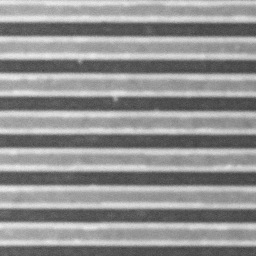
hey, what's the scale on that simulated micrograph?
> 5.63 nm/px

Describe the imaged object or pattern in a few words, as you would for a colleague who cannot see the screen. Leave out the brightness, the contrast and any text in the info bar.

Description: parallel lines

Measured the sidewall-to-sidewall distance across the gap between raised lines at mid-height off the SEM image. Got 110 nm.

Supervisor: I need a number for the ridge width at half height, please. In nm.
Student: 101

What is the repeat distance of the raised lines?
0.21 microns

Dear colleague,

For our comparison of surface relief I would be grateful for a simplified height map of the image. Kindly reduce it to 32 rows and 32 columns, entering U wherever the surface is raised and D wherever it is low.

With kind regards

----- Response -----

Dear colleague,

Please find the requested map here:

UUUUUUUUUUUUUUUUUUUUUUUUUUUUUUUU
UUUUUUUUUUUUUUUUUUUUUUUUUUUUUUUU
DDDDDDDDDDDDDDDDDDDDDDDDDDDDDDDD
DDDDDDDDDDDDDDDDDDDDDDDDDDDDDDDD
DDDDDDDDDDDDDDDDDDDDDDDDDDDDDDDD
UUUUUUUUUUUUUUUUUUUUUUUUUUUUUUUU
UUUUUUUUUUUUUUUUUUUUUUUUUUUUUUUU
DDDDDDDDDDDDDDDDDDDDDDDDDDDDDDDD
DDDDDDDDDDDDDDDDDDDDDDDDDDDDDDDD
DDDDDDDDDDDDDDDDDDDDDDDDDDDDDDDD
UUUUUUUUUUUUUUUUUUUUUUUUUUUUUUUU
UUUUUUUUUUUUUUUUUUUUUUUUUUUUUUUU
DDDDDDDDDDDDDDDDDDDDDDDDDDDDDDDD
DDDDDDDDDDDDDDDDDDDDDDDDDDDDDDDD
UUUUUUUUUUUUUUUUUUUUUUUUUUUUUUUU
UUUUUUUUUUUUUUUUUUUUUUUUUUUUUUUU
DDDDDDDDDDDDDDDDDDDDDDDDDDDDDDDD
DDDDDDDDDDDDDDDDDDDDDDDDDDDDDDDD
DDDDDDDDDDDDDDDDDDDDDDDDDDDDDDDD
UUUUUUUUUUUUUUUUUUUUUUUUUUUUUUUU
UUUUUUUUUUUUUUUUUUUUUUUUUUUUUUUU
DDDDDDDDDDDDDDDDDDDDDDDDDDDDDDDD
DDDDDDDDDDDDDDDDDDDDDDDDDDDDDDDD
DDDDDDDDDDDDDDDDDDDDDDDDDDDDDDDD
UUUUUUUUUUUUUUUUUUUUUUUUUUUUUUUU
UUUUUUUUUUUUUUUUUUUUUUUUUUUUUUUU
DDDDDDDDDDDDDDDDDDDDDDDDDDDDDDDD
DDDDDDDDDDDDDDDDDDDDDDDDDDDDDDDD
UUUUUUUUUUUUUUUUUUUUUUUUUUUUUUUU
UUUUUUUUUUUUUUUUUUUUUUUUUUUUUUUU
DDDDDDDDDDDDDDDDDDDDDDDDDDDDDDDD
DDDDDDDDDDDDDDDDDDDDDDDDDDDDDDDD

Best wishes